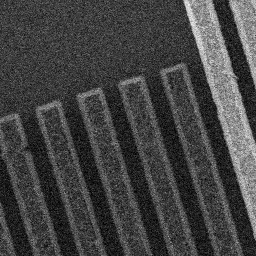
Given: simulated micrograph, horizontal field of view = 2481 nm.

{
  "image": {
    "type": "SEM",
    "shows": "parallel lines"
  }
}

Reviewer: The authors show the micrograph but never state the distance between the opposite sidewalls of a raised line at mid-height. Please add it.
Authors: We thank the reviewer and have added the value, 203 nm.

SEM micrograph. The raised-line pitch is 416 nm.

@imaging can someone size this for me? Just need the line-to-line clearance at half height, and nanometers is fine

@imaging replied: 220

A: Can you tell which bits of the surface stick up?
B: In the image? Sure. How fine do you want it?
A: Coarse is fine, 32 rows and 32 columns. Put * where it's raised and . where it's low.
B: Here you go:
........................**...***
........................**....**
........................***...**
........................***...**
.........................**...**
.........................***...*
.........................***...*
..........................**...*
......................*...***...
.....................**...***...
................**...***...**...
...............***...***...**...
..........***...**...***...***..
......*...***...***...**....**..
.....***...**...***...***...**..
**...***...***...**...***...***.
***...**...***...***...**...***.
***...***...**...***...***...**.
.**...***...***...**...***...***
.**...***...***...***...**...***
.***...**....**...***...***...**
.***...***...**...***...***...**
..**...***...***...**...***...**
..***...**...***...***...**...**
..***...***...**...***...***...*
...**...***...***...**...***...*
...***...**...***...***...**...*
...***...***...**...***...***...
*...**...***...***...**...***...
*...***...**...***...***...**...
*...***...**....**...***...***..
*...***...***...***..***...***..